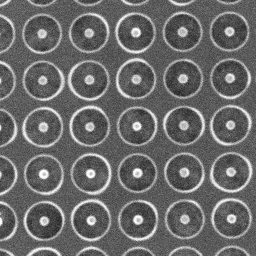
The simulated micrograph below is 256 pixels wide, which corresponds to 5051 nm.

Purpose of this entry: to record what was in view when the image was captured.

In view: an array of small figures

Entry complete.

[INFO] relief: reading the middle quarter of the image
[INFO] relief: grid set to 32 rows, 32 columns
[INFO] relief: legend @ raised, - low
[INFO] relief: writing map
@@@------@@@@@@------@@@@@------
@@--------@@@@--------@@@@------
@@---------@@----------@@-------
@-----@----@@----@@----@@----@@-
@-----@----@@----@@----@@----@--
@@---------@@@--------@@@@------
@@--------@@@@--------@@@@------
@@@------@@@@@@------@@@@@@-----
@@@@@---@@@@@@@@@-@@@@@@@@@@@@@@
@@@@@@@@@@@@@@@@@@@@@@@@@@@@@@@@
@@@@@@@@@@@@@@@@@@@@@@@@@@@@@@@@
@@@@-----@@@@@@@-----@@@@@@@----
@@@-------@@@@@-------@@@@------
@@---------@@@---------@@-------
@@---------@@@---------@@-------
@@----@----@@-----@----@@----@@-
@@----@----@@@---------@@-------
@@---------@@@---------@@@------
@@@-------@@@@@-------@@@@------
@@@@-----@@@@@@@-----@@@@@@@----
@@@@@@@@@@@@@@@@@@@@@@@@@@@@@@@@
@@@@@@@@@@@@@@@@@@@@@@@@@@@@@@@@
@@@@@@@@@@@@@@@@@@@@@@@@@@@@@--@
@@@@------@@@@@@-----@@@@@@-----
@@@--------@@@@-------@@@@------
@@---------@@@---------@@@------
@@----------@@----@----@@----@@-
@@----@-----@@---@@----@@----@@-
@@---------@@@---------@@@------
@@---------@@@--------@@@@------
@@@-------@@@@@-------@@@@@-----
@@@@------@@@@@@----@@@@@@@@----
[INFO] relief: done